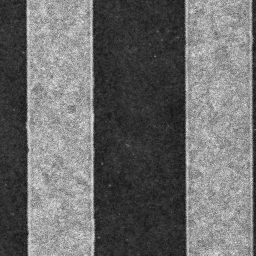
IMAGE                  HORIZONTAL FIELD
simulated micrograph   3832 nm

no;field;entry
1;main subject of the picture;one or a few lines or trenches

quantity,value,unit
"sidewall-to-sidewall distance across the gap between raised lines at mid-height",1420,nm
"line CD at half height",0.953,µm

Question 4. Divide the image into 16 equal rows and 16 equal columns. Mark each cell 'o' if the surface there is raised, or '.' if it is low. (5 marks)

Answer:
..oooo......oooo
..oooo......oooo
..oooo......oooo
..oooo......oooo
..oooo......oooo
..oooo......oooo
..oooo......oooo
..oooo......oooo
..oooo......oooo
..oooo......oooo
..oooo......oooo
..oooo......oooo
..oooo......oooo
..oooo......oooo
..oooo......oooo
..oooo......oooo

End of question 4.